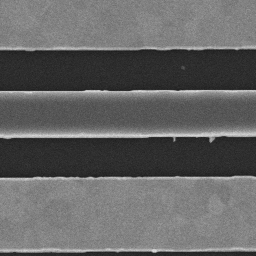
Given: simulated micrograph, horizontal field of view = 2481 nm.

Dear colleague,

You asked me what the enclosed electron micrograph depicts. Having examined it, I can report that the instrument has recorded lines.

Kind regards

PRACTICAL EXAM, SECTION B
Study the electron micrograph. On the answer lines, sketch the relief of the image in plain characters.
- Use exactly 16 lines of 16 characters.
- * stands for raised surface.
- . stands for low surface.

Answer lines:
****************
****************
****************
................
................
................
****************
****************
****************
................
................
****************
****************
****************
****************
****************